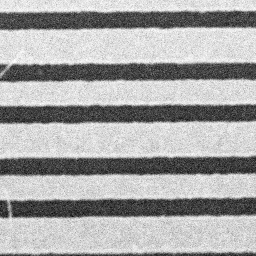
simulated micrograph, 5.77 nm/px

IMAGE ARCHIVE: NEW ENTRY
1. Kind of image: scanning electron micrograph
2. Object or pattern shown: lines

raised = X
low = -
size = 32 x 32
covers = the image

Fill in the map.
XXXXXXXXXXXXXXXXXXXXXXXXXXXXXXXX
--------------------------------
--------------------------------
--------------------------------
XXXXXXXXXXXXXXXXXXXXXXXXXXXXXXXX
XXXXXXXXXXXXXXXXXXXXXXXXXXXXXXXX
XXXXXXXXXXXXXXXXXXXXXXXXXXXXXXXX
XXXXXXXXXXXXXXXXXXXXXXXXXXXXXXXX
--------------------------------
--------------------------------
XXXXXXXXXXXXXXXXXXXXXXXXXXXXXXXX
XXXXXXXXXXXXXXXXXXXXXXXXXXXXXXXX
XXXXXXXXXXXXXXXXXXXXXXXXXXXXXXXX
--------------------------------
--------------------------------
------X---XXXXXXXXXXXXXXXXXXXXXX
XXXXXXXXXXXXXXXXXXXXXXXXXXXXXXXX
XXXXXXXXXXXXXXXXXXXXXXXXXXXXXXXX
XXXXXXXXXXXXXXXXXXXXXXXXXXXXXXXX
XX-------X----XXX---------------
--------------------------------
--------------------------------
XXXXXXXXXXXXXXXXXXXXXXXXXXXXXXXX
XXXXXXXXXXXXXXXXXXXXXXXXXXXXXXXX
XXXXXXXXXXXXXXXXXXXXXXXXXXXXXXXX
--------------------------------
--------------------------------
XXXXXXXXXXXXXXXXXXXXXXXXXXXXXXXX
XXXXXXXXXXXXXXXXXXXXXXXXXXXXXXXX
XXXXXXXXXXXXXXXXXXXXXXXXXXXXXXXX
XXXXXXXXXXXXXXXXXXXXXXXXXXXXXXXX
XXX-X---------------------------